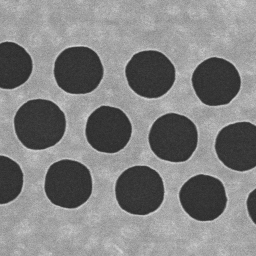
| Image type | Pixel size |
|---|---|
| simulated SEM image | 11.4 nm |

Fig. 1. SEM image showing a regular array of holes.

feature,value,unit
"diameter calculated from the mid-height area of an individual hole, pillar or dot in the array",560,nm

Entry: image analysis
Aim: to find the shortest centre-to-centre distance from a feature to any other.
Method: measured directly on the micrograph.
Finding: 754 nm